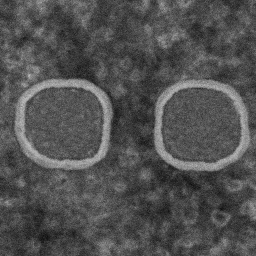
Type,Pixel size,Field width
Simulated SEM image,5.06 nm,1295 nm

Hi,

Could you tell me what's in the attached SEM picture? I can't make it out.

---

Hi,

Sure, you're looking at raised bodies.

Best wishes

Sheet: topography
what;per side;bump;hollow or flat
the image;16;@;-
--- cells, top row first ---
----------------
----------------
----------------
----------------
----------------
--@@@@-----@@@--
-@@@@@@---@@@@@-
-@@@@@@---@@@@@-
-@@@@@@---@@@@@-
--@@@@----@@@@@-
------------@---
----------------
----------------
----------------
----------------
----------------